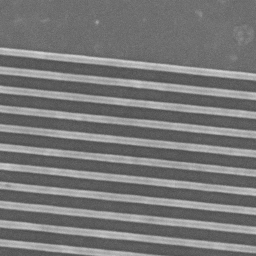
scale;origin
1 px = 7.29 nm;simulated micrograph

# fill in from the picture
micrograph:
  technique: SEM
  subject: parallel lines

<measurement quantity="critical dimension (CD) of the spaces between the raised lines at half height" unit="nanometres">92.4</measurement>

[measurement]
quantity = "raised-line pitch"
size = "139 nm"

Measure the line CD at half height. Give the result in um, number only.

0.0489